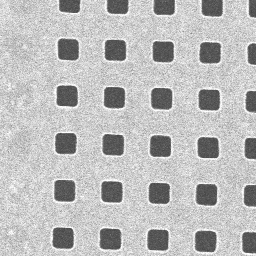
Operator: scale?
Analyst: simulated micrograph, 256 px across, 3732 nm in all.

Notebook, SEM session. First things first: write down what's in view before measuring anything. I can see a regular array of holes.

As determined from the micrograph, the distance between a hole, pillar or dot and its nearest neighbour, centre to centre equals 684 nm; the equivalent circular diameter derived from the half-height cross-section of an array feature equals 0.343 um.